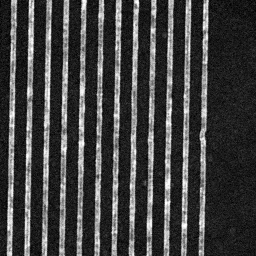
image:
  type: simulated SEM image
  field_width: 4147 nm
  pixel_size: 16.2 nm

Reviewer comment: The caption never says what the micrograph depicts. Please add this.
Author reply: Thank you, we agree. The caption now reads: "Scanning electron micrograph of parallel lines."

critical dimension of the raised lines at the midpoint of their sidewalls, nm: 62.8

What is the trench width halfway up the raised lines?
219 nanometres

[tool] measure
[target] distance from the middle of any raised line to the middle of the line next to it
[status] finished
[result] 282 nm